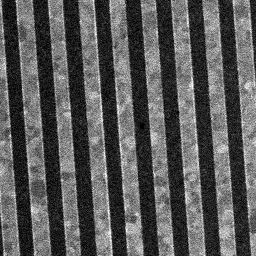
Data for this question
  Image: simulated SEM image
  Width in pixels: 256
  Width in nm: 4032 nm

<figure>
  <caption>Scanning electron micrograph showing parallel lines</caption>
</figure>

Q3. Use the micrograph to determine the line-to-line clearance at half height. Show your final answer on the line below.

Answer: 253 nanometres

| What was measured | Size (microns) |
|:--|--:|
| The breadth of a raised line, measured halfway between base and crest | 0.236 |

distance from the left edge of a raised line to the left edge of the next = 30.9 px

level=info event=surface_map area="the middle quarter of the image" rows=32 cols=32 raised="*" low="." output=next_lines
*....****....***.....***....****
*....****....***.....***....****
*....****....***.....***....****
*....****....****....***....****
*....****....****....***....****
*....****....****....***.....***
*....****....****....***.....***
*....****....****....***.....***
*.....***....****....***.....***
*.....***....****....****....***
*.....***....****....****....***
*.....***.....***....****....***
*.....***.....***....****....***
**....***.....***....****....***
**....****....***.....***....***
**....****....***.....***....***
**....****....***.....***....***
**....****....****....***....***
**....****....****....***....***
**....****....****....***.....**
**....****....****....***.....**
**....****....****....***.....**
**.....***....****....****....**
**.....***....****....****....**
**.....***....****....****....**
**.....***.....***....****....**
**.....***.....***.....***....**
***....***.....***.....***....**
***....****....***.....***....**
***....****....***.....***....**
***....****....***.....***....**
***....****....****....***....**